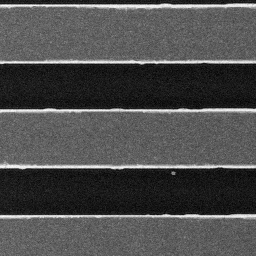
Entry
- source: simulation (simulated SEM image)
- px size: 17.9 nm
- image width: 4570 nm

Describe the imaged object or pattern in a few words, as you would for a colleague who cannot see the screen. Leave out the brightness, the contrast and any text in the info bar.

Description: lines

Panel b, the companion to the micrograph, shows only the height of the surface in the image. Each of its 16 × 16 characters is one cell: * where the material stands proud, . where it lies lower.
****************
****************
****************
****************
................
................
................
****************
****************
****************
................
................
................
****************
****************
****************